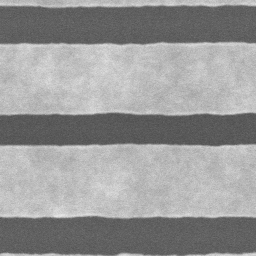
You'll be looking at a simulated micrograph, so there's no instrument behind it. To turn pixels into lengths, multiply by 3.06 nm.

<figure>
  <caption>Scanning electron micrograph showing lines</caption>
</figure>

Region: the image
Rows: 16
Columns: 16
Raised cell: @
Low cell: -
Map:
----------------
----------------
----------------
@@@@@@@@@@@@@@@@
@@@@@@@@@@@@@@@@
@@@@@@@@@@@@@@@@
@@@@@@@@@@@@@@@@
----------------
----------------
@@@@@@@@@@@@@@@@
@@@@@@@@@@@@@@@@
@@@@@@@@@@@@@@@@
@@@@@@@@@@@@@@@@
@@@@@@@@@@@@@@@@
----------------
----------------